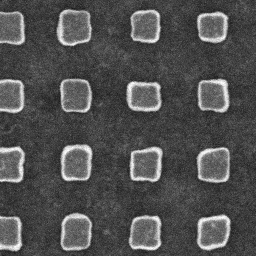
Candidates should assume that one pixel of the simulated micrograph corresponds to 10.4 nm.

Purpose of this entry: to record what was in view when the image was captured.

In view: a regular array of raised bodies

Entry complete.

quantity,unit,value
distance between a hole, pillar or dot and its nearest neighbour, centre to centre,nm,703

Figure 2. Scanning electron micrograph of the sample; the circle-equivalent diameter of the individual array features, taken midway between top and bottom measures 350 nanometres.